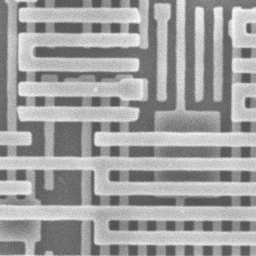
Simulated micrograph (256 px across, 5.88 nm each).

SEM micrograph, wiring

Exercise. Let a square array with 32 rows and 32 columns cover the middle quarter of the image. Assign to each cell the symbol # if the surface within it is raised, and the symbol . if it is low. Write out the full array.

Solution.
##################..............
##################..............
................................
................................
..............######............
####################............
####################............
####################............
..............#####.............
................................
................................
###################.............
###################.............
##################..............
................................
................................
................................
........########################
........########################
........########################
.........#......................
................................
................................
############################....
################################
################################
.......#####........####........
........###.....................
........###.....................
........####....................
........########################
........########################